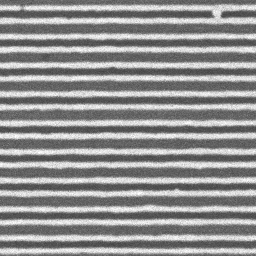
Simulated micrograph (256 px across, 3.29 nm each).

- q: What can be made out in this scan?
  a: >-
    parallel lines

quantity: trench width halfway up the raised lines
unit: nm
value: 24.3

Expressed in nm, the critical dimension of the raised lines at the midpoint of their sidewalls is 21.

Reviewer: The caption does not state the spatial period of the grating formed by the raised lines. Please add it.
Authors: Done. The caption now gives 47 nanometers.